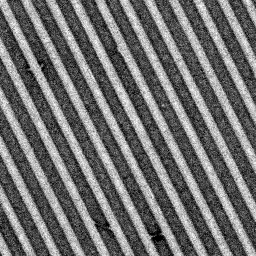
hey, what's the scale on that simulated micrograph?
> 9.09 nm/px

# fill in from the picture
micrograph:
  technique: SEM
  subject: parallel lines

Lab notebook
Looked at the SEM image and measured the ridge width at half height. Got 70.1 nanometers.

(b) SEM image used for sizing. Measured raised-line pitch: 200 nm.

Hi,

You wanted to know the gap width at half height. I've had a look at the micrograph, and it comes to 0.13 µm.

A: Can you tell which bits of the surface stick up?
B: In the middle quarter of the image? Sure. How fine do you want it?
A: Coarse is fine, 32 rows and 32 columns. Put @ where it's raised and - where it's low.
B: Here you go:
----@@----@@----@@----@@----@@--
----@@@---@@@----@@----@@----@@-
@----@@----@@----@@----@@----@@-
@----@@@---@@@----@@----@@----@@
@@----@@----@@----@@----@@----@@
@@----@@@---@@@----@@----@@----@
-@@----@@----@@----@@----@@----@
-@@----@@@---@@@----@@----@@----
--@@----@@----@@----@@----@@----
--@@----@@@---@@@----@@----@@---
---@@----@@----@@----@@----@@---
---@@----@@@---@@@----@@----@@--
----@@----@@----@@----@@----@@--
----@@----@@@---@@@----@@----@@-
@----@@----@@----@@----@@----@@-
@----@@----@@@---@@@----@@----@@
@@----@@----@@----@@----@@----@@
@@----@@----@@@---@@@----@@----@
-@@----@@----@@----@@----@@----@
-@@----@@----@@@---@@@----@@----
--@@----@@----@@----@@----@@----
--@@----@@----@@@---@@@----@@---
---@@----@@----@@----@@----@@---
---@@----@@----@@@---@@@----@@--
----@@----@@----@@----@@----@@--
----@@----@@----@@@---@@@----@@-
@----@@----@@----@@----@@----@@-
@----@@----@@----@@@---@@@----@@
@@----@@----@@----@@----@@----@@
@@----@@----@@----@@@---@@@----@
-@@----@@----@@----@@----@@----@
-@@----@@----@@----@@@---@@@----